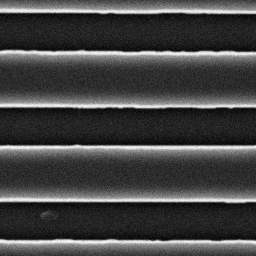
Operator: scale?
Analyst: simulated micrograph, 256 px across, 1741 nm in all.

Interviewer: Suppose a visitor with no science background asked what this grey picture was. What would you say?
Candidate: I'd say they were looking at lines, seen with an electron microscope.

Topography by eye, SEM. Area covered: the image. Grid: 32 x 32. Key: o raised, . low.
oooooooooooooooooooooooooooooooo
..oooooo.ooooooooooooooooooooooo
................................
................................
................................
................................
oooooo.ooooo....................
oooooooooooooooooooooooooooooooo
oooooooooooooooooooooooooooooooo
oooooooooooooooooooooooooooooooo
oooooooooooooooooooooooooooooooo
oooooooooooooooooooooooooooooooo
oooooooooooooooooooooooooooooooo
................................
................................
................................
................................
................................
oooooooooooooooooooooooooooooooo
oooooooooooooooooooooooooooooooo
oooooooooooooooooooooooooooooooo
oooooooooooooooooooooooooooooooo
oooooooooooooooooooooooooooooooo
oooooooooooooooooooooooooooooooo
oooooooooooooooooooooooooooooooo
................................
................................
................................
................................
................................
oooooooooooooooooooooooooooooooo
oooooooooooooooooooooooooooooooo